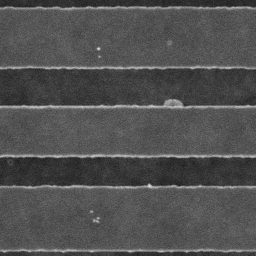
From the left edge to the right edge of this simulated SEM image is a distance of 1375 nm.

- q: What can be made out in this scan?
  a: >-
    lines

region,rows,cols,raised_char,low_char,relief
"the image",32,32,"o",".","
................................
oooooooooooooooooooooooooooooooo
oooooooooooooooooooooooooooooooo
oooooooooooooooooooooooooooooooo
oooooooooooooooooooooooooooooooo
oooooooooooooooooooooooooooooooo
oooooooooooooooooooooooooooooooo
oooooooooooooooooooooooooooooooo
ooo..oooooooooooooooo..oo.ooo.oo
................................
................................
................................
................................
oooooooooooooooooooooooooooooooo
oooooooooooooooooooooooooooooooo
oooooooooooooooooooooooooooooooo
oooooooooooooooooooooooooooooooo
oooooooooooooooooooooooooooooooo
oooooooooooooooooooooooooooooooo
oooooooooooooooooooooooooooooooo
................................
................................
................................
oooooooooooooooooooooooooooooooo
oooooooooooooooooooooooooooooooo
oooooooooooooooooooooooooooooooo
oooooooooooooooooooooooooooooooo
oooooooooooooooooooooooooooooooo
oooooooooooooooooooooooooooooooo
oooooooooooooooooooooooooooooooo
oooooooooooooooooooooooooooooooo
................................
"